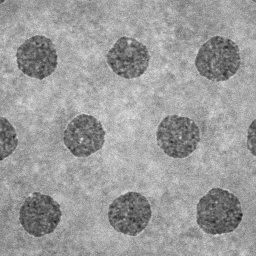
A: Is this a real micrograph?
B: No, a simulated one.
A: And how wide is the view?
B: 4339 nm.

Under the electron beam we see a regular array of raised bodies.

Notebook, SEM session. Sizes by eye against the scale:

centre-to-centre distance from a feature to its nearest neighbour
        89.2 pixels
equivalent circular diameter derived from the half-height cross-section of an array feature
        744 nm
